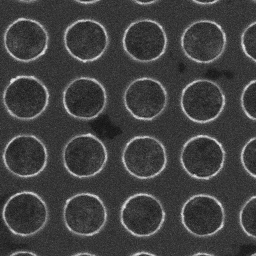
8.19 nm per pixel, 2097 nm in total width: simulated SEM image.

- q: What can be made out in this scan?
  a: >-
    a regular array of holes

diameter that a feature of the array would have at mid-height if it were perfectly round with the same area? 323 nm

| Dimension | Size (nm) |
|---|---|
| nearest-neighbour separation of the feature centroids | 473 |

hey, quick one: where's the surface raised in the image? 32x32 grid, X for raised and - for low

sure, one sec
XXXXXXXXXXXXXXXXXXXXXXXXXXXXXXXX
XXXXXXXXXXXXXXXXXXXXXXXXXXXXXXXX
XXXXXXXXXXXXXXXXXXXXXXXXXXXXXXXX
X----XXXX----XXX----XXXX---XXXX-
X-----XX-----XXX----XXX-----XX--
X-----XX-----XXX-----XX-----XXX-
X----XXXX----XXX----XXX-----XXX-
XXXXXXXXXXXXXXXXXXXXXXXXX-XXXXXX
XXXXXXXXXXXXXXXXXXXXXXXXXXXXXXXX
XXXXXXXXXXXXXXXXXXXXXXXXXXXXXXXX
X----XXXX---XXXXX---XXXX---XXXXX
X-----XX-----XXX----XXX-----XXX-
X-----XX-----XXX-----XX-----XX--
X----XXX-----XXX----XXX-----XXX-
XX--XXXXXX--XXXXX--XXXXX---XXXXX
XXXXXXXXXXXXXXXXXXXXXXXXXXXXXXXX
XXXXXXXXXXXXXXXXXXXXXXXXXXXXXXXX
XX---XXXX---XXXXX--XXXXX---XXXXX
X----XXX-----XXX----XXX----XXXX-
X-----XX-----XXX-----XX-----XX--
X----XXX-----XXX----XXX-----XXX-
XX---XXXX---XXXX----XXXX---XXXX-
XXXXXXXXXXXXXXXXXXXXXXXXXXXXXXXX
XXXXXXXXXXXXXXXXXXXXXXXXXXXXXXXX
XX--XXXXXX-XXXXXXXXXXXXXXXXXXXXX
X----XXXX----XXX----XXX----XXXX-
X-----XX-----XX-----XXX-----XX--
X-----XX-----XX-----XXX-----XX--
X----XXXX---XXXX----XXXX---XXXX-
XXXXXXXXXXXXXXXXXXXXXXXXXXXXXXXX
XXXXXXXXXXXXXXXXXXXXXXXXXXXXXXXX
XXXXXXXXXXXXXXXXXXXXXXXXXXXXXXXX